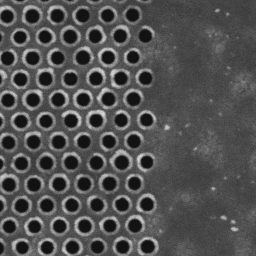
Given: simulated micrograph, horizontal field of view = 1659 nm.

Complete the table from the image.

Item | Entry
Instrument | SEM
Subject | a regular array of holes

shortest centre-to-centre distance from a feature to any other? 157 nanometers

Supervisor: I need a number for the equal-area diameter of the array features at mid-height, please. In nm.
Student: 84.3